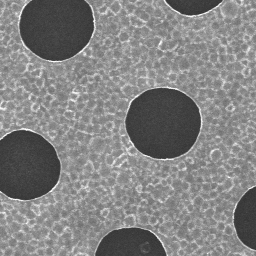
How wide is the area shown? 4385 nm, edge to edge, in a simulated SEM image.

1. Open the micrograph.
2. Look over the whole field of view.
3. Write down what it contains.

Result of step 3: holes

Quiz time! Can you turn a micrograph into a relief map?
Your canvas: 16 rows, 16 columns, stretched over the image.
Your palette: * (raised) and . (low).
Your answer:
**....*****..***
*.....**********
*.....**********
**...***********
****************
****************
********....****
********.....***
...*****....****
...******...****
....************
...*************
***************.
***************.
*******..******.
******....******